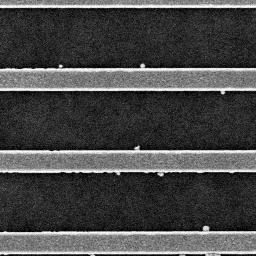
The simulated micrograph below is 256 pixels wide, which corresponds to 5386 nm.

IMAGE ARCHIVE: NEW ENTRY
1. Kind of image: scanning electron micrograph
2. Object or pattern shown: lines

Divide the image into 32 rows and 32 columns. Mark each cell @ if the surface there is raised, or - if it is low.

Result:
@@@@@@@@@@@@@@@@@@@@@@@@@@@@@@@@
--------------------------------
--------------------------------
--------------------------------
--------------------------------
--------------------------------
--------------------------------
--------------------------------
--------------------------------
@@@@@@@@@@@@@@@@@@@@@@@@@@@@@@@@
@@@@@@@@@@@@@@@@@@@@@@@@@@@@@@@@
--------------------------------
--------------------------------
--------------------------------
--------------------------------
--------------------------------
--------------------------------
--------------------------------
--------------------------------
@@@@@@@@@@@@@@@@@@@@@@@@@@@@@@@@
@@@@@@@@@@@@@@@@@@@@@@@@@@@@@@@@
--------------------------------
--------------------------------
--------------------------------
--------------------------------
--------------------------------
--------------------------------
--------------------------------
--------------------------------
@@@@@@@@@@@@@@@@@@@@@@@@@@@@@@@@
@@@@@@@@@@@@@@@@@@@@@@@@@@@@@@@@
@@@@@@@@@@@@@@@@@@@@@@@@@@@@@@@@